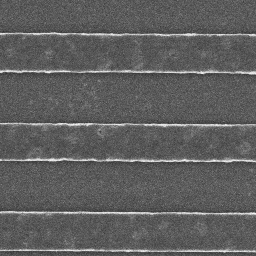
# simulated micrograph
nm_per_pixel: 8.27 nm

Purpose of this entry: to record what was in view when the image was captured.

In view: one or a few lines or trenches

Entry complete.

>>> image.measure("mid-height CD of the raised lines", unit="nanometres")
318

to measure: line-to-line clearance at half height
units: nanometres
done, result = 429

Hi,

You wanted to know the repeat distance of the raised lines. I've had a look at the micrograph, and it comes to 739 nanometres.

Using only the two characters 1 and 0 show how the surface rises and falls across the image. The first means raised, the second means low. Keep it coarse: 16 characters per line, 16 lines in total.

0000000000000000
0000000000000000
1111111111111111
1111111111111111
1111110011111111
0000000000000000
0000000000000000
0000000000000000
1111111111111111
1111111111111111
0000000000000000
0000000000000000
0000000000000000
1111111111111111
1111111111111111
1111111111111111